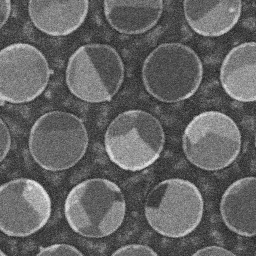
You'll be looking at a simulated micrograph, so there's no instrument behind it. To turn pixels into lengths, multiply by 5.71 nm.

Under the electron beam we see raised bodies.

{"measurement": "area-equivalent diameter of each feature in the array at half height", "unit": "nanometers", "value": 331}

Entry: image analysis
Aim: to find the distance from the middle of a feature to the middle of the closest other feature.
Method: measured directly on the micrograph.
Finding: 437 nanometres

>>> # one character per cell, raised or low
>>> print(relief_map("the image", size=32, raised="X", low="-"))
X---XXXXXXX--XXXXXXX---XXXXXXX--
X---XXXXXXX--XXXXXXX---XXXXXXX--
X---XXXXXX---XXXXXXX---XXXXXXX--
-----XXXXX----XXXXX-----XXXXX---
--------------------------------
--X-----------------XXX-------XX
XXXXX-----XXXXX----XXXXX-----XXX
XXXXXX---XXXXXX---XXXXXXX---XXXX
XXXXXX--XXXXXXX---XXXXXXX---XXXX
XXXXXX--XXXXXXX---XXXXXXX---XXXX
XXXXXX--XXXXXXX---XXXXXXX---XXXX
XXXXX----XXXXX-----XXXXX----XXXX
XXXX-------XX-------XX--------XX
--------------------------------
-----XXXX------XXXX------XXX----
----XXXXXX----XXXXXX----XXXXX---
X---XXXXXXX--XXXXXXX---XXXXXXX--
X---XXXXXXX--XXXXXXXX--XXXXXXX--
X---XXXXXXX--XXXXXXX---XXXXXXX--
X---XXXXXX----XXXXXX---XXXXXXX--
-----XXXX------XXXX-----XXXXX---
--------------------------------
--XX-------XX--------X--------XX
XXXXX----XXXXXX----XXXXXX----XXX
XXXXXX---XXXXXX----XXXXXX---XXXX
XXXXXX--XXXXXXXX--XXXXXXX---XXXX
XXXXXX--XXXXXXXX--XXXXXXX---XXXX
XXXXXX---XXXXXX----XXXXXX---XXXX
XXXXX----XXXXXX----XXXXX-----XXX
-----------XX--------X----------
--------------------------------
-----XXXXX-----XXXX------XXXX---